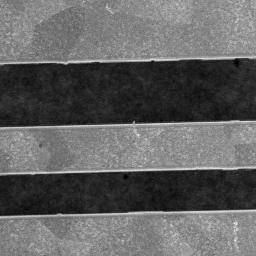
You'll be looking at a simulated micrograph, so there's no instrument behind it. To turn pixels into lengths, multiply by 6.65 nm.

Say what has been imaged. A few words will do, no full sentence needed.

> one or a few lines or trenches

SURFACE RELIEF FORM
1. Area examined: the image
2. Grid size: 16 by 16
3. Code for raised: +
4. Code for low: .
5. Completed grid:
++++++++++++++++
++++++++++++++++
++++++++++++++++
++++++++++++++++
................
................
................
................
++++++++++++++++
++++++++++++++++
+++++++++++++++.
................
................
...+++++++++++++
++++++++++++++++
++++++++++++++++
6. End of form